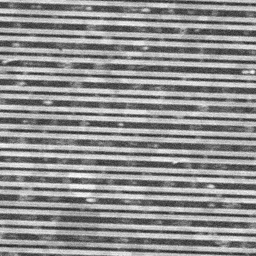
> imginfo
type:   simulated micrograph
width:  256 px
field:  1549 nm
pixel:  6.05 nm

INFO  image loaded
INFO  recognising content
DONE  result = parallel lines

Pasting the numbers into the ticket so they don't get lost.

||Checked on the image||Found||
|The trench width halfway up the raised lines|0.0317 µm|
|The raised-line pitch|58.2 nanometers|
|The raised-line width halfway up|20.4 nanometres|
